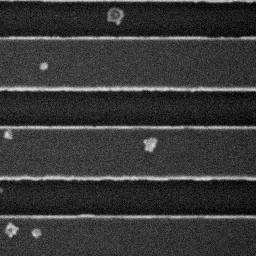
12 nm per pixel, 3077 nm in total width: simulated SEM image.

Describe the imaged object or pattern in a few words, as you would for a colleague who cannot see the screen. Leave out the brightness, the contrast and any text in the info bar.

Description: lines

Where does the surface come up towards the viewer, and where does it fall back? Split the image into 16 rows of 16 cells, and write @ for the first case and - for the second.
----------------
----------------
@@@@@@@@@@@@@@@@
@@@@@@@@@@@@@@@@
@@@@@@@@@@@@@@@@
@@@@@@@@@@@@@@@@
----------------
----------------
@@@@@@@@@@@@@@@@
@@@@@@@@@@@@@@@@
@@@@@@@@@@@@@@@@
----------------
----------------
-----@----------
@@@@@@@@@@@@@@@@
@@@@@@@@@@@@@@@@